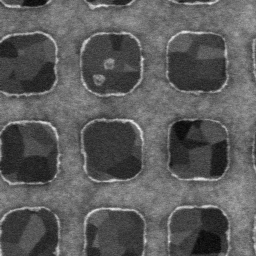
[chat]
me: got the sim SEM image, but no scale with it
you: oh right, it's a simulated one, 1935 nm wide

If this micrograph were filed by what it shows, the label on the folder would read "raised bodies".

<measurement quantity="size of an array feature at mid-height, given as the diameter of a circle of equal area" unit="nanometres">499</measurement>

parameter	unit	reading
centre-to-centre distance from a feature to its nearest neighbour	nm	648